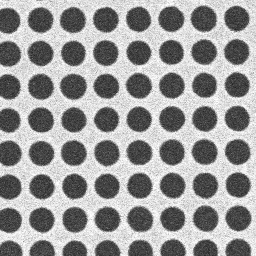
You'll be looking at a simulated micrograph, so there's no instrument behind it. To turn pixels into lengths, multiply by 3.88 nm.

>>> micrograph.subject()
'a regular array of holes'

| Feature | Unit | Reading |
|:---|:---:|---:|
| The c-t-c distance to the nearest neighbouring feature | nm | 127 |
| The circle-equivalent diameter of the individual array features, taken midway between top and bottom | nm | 98.5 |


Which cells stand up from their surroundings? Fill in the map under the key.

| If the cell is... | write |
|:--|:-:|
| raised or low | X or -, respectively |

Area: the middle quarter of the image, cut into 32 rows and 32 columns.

XX-XXXXXXX-XXXXXXXXXXXXXXXXXXXXX
XXXXXXXXXXXXXXXXXXXXXXXXXXXXXXXX
X--XXXXXXX-XXXXXXX--XXXXXX---XXX
-----XXX-----XXX-----XXX-----XXX
-----XXX-----XXX------XX------XX
------X-------X-------XX------XX
-----XXX------XX------XX------XX
-----XXX-----XXX-----XXXX----XXX
X---XXXXXX--XXXXXX--XXXXXX--XXXX
XXXXXXXXXXXXXXXXXXXXXXXXXXXXXXXX
XXXXXXXXXXXXXXXXXXXXXXXXXX-XXXXX
X---XXXXX----XXX-----XXXX----XXX
-----XXX-----XXX------XX------XX
------XX------XX------XX------XX
------XX------XX------XX------XX
-----XXX-----XXX------XX------XX
X---XXXXX----XXXX----XXXX----XXX
XXXXXXXXXXXXXXXXXXXXXXXXXXXXXXXX
XXXXXXXXXXXXXXXXXXXXXXXXXXXXXXXX
X---XXXXX---XXXXX---XXXXX----XXX
-----XXX-----XXX-----XXX------XX
------X-------XX------XX------XX
------X-------XX------XX------XX
-----XXX------XX------XX------XX
-----XXXX----XXXX----XXXX----XXX
XX-XXXXXXX--XXXXXXXXXXXXXXXXXXXX
XXXXXXXXXXXXXXXXXXXXXXXXXXXXXXXX
XX-XXXXXXX-XXXXXXX--XXXXXX--XXXX
-----XXX-----XXXX----XXXX-----XX
------XX------XX------XX------XX
------XX------XX------XX------XX
------XX------XX------XX------XX